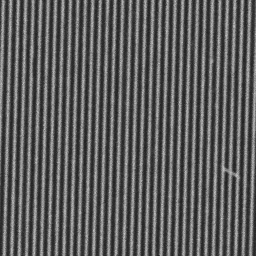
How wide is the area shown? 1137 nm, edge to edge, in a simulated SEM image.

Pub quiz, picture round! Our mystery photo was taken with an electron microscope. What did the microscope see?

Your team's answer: parallel lines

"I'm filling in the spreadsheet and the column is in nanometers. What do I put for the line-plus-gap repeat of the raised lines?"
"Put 33.2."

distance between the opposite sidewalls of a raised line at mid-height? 11.7 nanometers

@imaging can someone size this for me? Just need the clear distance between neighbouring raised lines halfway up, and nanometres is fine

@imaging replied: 19.4